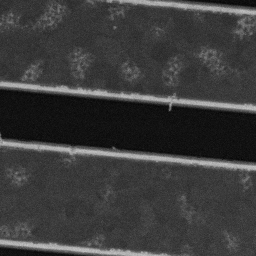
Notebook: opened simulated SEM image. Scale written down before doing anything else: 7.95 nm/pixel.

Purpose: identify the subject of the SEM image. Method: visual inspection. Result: one or a few lines or trenches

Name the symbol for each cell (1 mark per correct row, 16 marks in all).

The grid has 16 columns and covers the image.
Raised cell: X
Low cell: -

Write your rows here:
XXXXXXXXXXXXX---
XXXXXXXXXXXXXXXX
XXXXXXXXXXXXXXXX
XXXXXXXXXXXXXXXX
XXXXXXXXXXXXXXXX
---XXXXXXXXXXXXX
-------------XXX
----------------
----------------
XXXXX-----------
XXXXXXXXXXXXXXXX
XXXXXXXXXXXXXXXX
XXXXXXXXXXXXXXXX
XXXXXXXXXXXXXXXX
XXXXXXXXXXXXXXXX
----XXXXXXXXXXXX